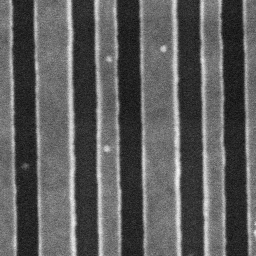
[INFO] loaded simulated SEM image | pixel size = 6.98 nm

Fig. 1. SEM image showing lines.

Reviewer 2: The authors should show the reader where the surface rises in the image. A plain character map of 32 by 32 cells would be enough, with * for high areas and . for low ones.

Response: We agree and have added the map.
**..*****...**....****...***..**
**..*****...**....****...***..**
**..*****...***...****...***..**
**..*****...***...****...***...*
**..*****...***...****...***...*
**..*****...***...****...***...*
**..*****...***...****...***...*
**..*****...***...****...***...*
**..*****...***...****...***...*
**...****...***...****...***...*
**...****...***...****...***...*
**..*****...***...****...***...*
**...****...***...****...***...*
**...****...***...****...***...*
**...****...***...****...***...*
**...****...***...****...***...*
**...****...***...****...***...*
**...****...***...****...***...*
**...****...***...****...***...*
**...****...***...****...***...*
**...****...***...****...***...*
**...****...***...****...***...*
**...****...***...****...***...*
**...****...***...****...***...*
**...****...***...****....**...*
**...****...***...****...***...*
**...****...***...****....**...*
**...****...***...****....**...*
**...****...***...****....**...*
**...****...***...****....**...*
**...****...***...****....**...*
**...****...***...****....**...*